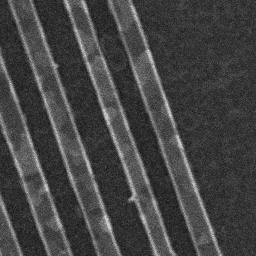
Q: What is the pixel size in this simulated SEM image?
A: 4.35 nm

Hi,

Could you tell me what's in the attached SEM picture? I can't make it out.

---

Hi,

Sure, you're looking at parallel lines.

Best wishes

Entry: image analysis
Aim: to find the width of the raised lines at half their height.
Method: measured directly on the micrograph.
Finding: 0.0836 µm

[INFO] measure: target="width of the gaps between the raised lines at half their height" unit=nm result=118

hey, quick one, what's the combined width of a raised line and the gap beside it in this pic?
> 205 nm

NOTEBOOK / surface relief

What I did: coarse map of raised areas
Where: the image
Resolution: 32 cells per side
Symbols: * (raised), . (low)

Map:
.***....***...**................
..**.....**...***...............
..***....**....**...............
..***....**....***..............
...**.....**...***..............
...***....**....**..............
....**....***...***.............
....**.....**...***.............
*...***....**....**.............
*....**.....**...***............
*....**.....**...***............
**...***....**....**............
**....**.....**...***...........
**....***....**....**...........
***...***....**....**...........
***....**.....**...***..........
.**....***....**....**..........
.***...***....***...**..........
.***....**.....**...***.........
..**....***....**....**.........
..***...***....***...**.........
...**....**.....**...***........
...**....***....**....**........
...***...***.....**...**........
....**....**.....**...***.......
....***...***....**....**.......
*...***...***.....**...***......
*....**....**.....**...***......
*....***...***....**....**......
**...***....**.....**...***.....
**....**....**.....**...***.....
**....***...***....***...**.....